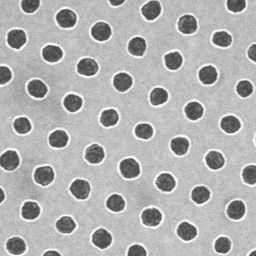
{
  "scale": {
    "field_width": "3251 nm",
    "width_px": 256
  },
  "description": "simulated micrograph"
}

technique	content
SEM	a regular array of holes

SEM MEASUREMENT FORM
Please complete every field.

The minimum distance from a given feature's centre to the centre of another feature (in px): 37.6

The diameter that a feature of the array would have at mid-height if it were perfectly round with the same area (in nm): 258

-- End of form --